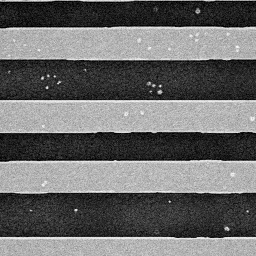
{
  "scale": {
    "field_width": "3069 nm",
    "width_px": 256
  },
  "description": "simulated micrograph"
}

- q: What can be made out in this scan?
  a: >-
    lines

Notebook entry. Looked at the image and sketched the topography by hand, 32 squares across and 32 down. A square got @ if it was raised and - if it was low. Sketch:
--------------------------------
--------------------------------
--------------------------------
--------------@@@@@@@@@@@@@@----
@@@@@@@@@@@@@@@@@@@@@@@@@@@@@@@@
@@@@@@@@@@@@@@@@@@@@@@@@@@@@@@@@
@@@@@@@@@@@@@@@@@@@@@@@@@@@@@@@@
--------------------------------
--------------------------------
--------------------------------
--------------------------------
--------------------------------
--------------------------------
@@@@@@@@@@@@@@@@@@@@@@@@@@@@@@@@
@@@@@@@@@@@@@@@@@@@@@@@@@@@@@@@@
@@@@@@@@@@@@@@@@@@@@@@@@@@@@@@@@
@@@@@@@@@@@@--@@----------@@@@--
--------------------------------
--------------------------------
--------------------------------
@@@@@@@@@@@@@@@@@@@@@@@@@@@@@@@@
@@@@@@@@@@@@@@@@@@@@@@@@@@@@@@@@
@@@@@@@@@@@@@@@@@@@@@@@@@@@@@@@@
@@@@@@@@@@@@@@@@@@@@@@@@@@@@@@@@
--------------------------------
--------------------------------
--------------------------------
--------------------------------
--------------------------------
--------------------------------
@@@@@@@@@@@@@@@@@@@@@@@@@@@@@@@@
@@@@@@@@@@@@@@@@@@@@@@@@@@@@@@@@